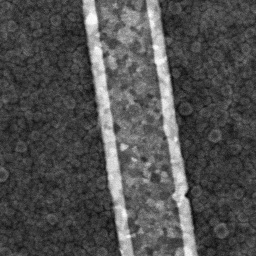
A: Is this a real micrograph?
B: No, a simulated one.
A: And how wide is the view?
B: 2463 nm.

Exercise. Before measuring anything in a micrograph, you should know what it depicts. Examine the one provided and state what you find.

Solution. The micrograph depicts one or a few lines or trenches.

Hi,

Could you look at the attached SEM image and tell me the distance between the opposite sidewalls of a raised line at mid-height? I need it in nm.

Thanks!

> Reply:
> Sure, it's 592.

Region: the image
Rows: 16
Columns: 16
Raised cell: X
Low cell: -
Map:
------XXXX------
------XXXX------
------XXXX------
------XXXX------
------XXXX------
------XXXX------
-------XXX------
-------XXXX-----
-------XXXX-----
-------XXXX-----
-------XXXX-----
-------XXXX-----
-------XXXX-----
--------XXXX----
--------XXXX----
--------XXXX----